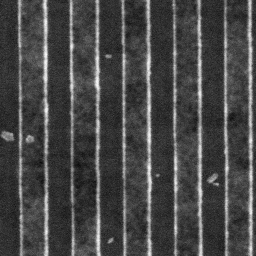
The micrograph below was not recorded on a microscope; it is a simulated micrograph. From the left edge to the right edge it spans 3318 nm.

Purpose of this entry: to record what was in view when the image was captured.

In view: lines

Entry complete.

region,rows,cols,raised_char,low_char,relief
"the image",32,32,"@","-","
--@@@@---@@@---@@@@---@@@---@@@-
--@@@@---@@@---@@@@---@@@---@@@-
--@@@@---@@@---@@@@---@@@---@@@-
--@@@@---@@@---@@@@---@@@---@@@-
--@@@@---@@@---@@@@---@@@---@@@-
---@@@---@@@---@@@@---@@@---@@@-
---@@@---@@@---@@@@---@@@---@@@-
---@@@---@@@---@@@@---@@@---@@@-
---@@@---@@@---@@@@---@@@---@@@-
---@@@---@@@---@@@@---@@@---@@@-
---@@@---@@@---@@@@---@@@---@@@-
---@@@---@@@---@@@@---@@@---@@@-
---@@@---@@@---@@@@---@@@---@@@-
---@@@---@@@---@@@@---@@@---@@@-
---@@@---@@@---@@@@---@@@---@@@-
---@@@---@@@---@@@@---@@@---@@@-
---@@@---@@@---@@@@---@@@---@@@-
---@@@---@@@---@@@@---@@@---@@@-
---@@@---@@@---@@@@---@@@---@@@-
---@@@---@@@----@@@---@@@---@@@-
---@@@---@@@----@@@---@@@---@@@-
---@@@---@@@----@@@---@@@---@@@-
---@@@---@@@----@@@---@@@---@@@-
---@@@---@@@----@@@---@@@---@@@-
---@@@---@@@----@@@---@@@---@@@-
---@@@---@@@----@@@---@@@---@@@-
---@@@---@@@----@@@---@@@---@@@-
---@@@---@@@----@@@---@@@---@@@-
---@@@---@@@----@@@---@@@---@@@-
---@@@---@@@----@@@---@@@---@@@-
---@@@---@@@----@@@---@@@---@@@-
---@@@---@@@----@@@---@@@---@@@-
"